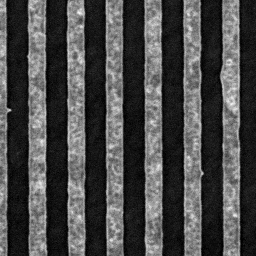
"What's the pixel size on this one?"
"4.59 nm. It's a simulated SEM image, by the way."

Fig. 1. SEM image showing parallel lines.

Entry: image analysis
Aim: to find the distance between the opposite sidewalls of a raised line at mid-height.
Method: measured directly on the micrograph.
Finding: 75.2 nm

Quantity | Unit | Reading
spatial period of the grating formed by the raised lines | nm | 178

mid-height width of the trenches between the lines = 104 nanometers